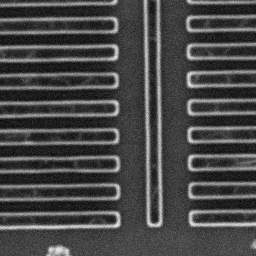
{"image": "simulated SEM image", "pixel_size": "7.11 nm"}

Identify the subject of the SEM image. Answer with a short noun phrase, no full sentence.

groups of lines, slits or small figures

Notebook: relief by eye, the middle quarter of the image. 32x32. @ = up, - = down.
---------------------@@@--------
---------------------@@@--------
---------------------@@@-------@
@@@@@@@@@@@@@--------@@@-------@
@@@@@@@@@@@@@--------@@@-------@
@@@@@@@@@@@@@--------@@@--------
---------------------@@@--------
---------------------@@@--------
---------------------@@@--------
---------@@@@--------@@@-------@
@@@@@@@@@@@@@--------@@@-------@
@@@@@@@@@@@@@--------@@@-------@
@@@@@@@@@@@@@--------@@@--------
---------------------@@@--------
---------------------@@@--------
---------------------@@@--------
----------@@---------@@@--------
@@@@@@@@@@@@@--------@@@-------@
@@@@@@@@@@@@@--------@@@-------@
@@@@@@@@@@@@@--------@@@--------
---------------------@@@--------
---------------------@@@--------
---------------------@@@--------
-----@@@@@@@@--------@@@--------
@@@@@@@@@@@@@@-------@@@--------
@@@@@@@@@@@@@@-------@@@--------
@@@@@@@@@@@@@--------@@@--------
---------------------@@@--------
---------------------@@@--------
---------------------@@@--------
---@@@@@@@@@@--------@@@--------
@@@@@@@@@@@@@@-------@@@--------